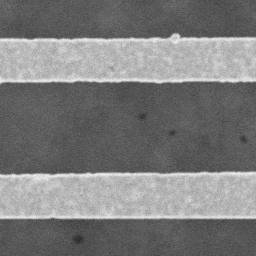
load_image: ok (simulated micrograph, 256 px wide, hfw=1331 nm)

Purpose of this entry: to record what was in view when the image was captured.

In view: lines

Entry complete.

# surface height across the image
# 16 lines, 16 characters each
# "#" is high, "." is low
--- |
................
................
################
################
################
................
................
................
................
................
................
################
################
################
................
................